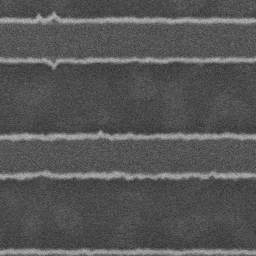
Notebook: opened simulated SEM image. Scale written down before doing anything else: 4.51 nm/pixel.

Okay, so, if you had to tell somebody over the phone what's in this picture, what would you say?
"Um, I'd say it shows one or a few lines or trenches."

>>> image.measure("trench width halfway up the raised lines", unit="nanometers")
342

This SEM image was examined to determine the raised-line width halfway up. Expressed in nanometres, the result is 179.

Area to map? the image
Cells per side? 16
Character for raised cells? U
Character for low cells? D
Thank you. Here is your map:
DDDDDDDDDDDDDDDD
UUUUUUUUUUUUUUUU
UUUUUUUUUUUUUUUU
UUUUUUUUUUUUUUUU
DDDDDDDDDDDDDDDD
DDDDDDDDDDDDDDDD
DDDDDDDDDDDDDDDD
DDDDDDDDDDDDDDDD
DDDDDUUDDDDDDDUD
UUUUUUUUUUUUUUUU
UUUUUUUUUUUUUUUU
DDDDDDDDDDDDDDDD
DDDDDDDDDDDDDDDD
DDDDDDDDDDDDDDDD
DDDDDDDDDDDDDDDD
DDDDDDDDDDDDDDDD